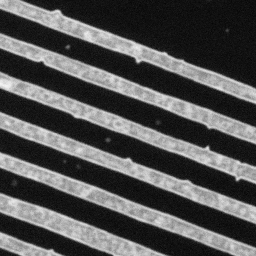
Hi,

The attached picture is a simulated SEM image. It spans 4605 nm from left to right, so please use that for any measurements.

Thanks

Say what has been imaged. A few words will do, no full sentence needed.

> parallel lines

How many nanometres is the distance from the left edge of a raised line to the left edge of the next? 674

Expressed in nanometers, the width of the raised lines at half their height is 246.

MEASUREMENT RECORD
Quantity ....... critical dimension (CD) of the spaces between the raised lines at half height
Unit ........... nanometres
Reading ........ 423